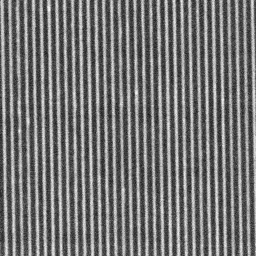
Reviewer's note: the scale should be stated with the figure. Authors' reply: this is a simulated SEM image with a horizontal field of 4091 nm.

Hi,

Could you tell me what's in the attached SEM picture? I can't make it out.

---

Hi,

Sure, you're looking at parallel lines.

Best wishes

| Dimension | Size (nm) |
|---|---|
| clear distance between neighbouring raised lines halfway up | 91.9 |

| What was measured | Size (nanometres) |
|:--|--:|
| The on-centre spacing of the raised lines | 125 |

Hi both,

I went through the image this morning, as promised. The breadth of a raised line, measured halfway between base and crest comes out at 34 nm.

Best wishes